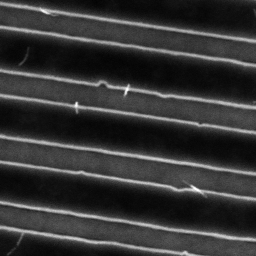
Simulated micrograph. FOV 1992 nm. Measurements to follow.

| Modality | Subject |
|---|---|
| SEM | one or a few lines or trenches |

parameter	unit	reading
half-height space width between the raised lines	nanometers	177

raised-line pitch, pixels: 66.2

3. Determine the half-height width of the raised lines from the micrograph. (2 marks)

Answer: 332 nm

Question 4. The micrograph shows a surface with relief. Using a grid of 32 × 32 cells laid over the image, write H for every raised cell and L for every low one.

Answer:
HHHHHHHHHHHHHHHHHHHHHHHHHHHHHHHH
LLLLLLHHHHHHHHHHHHHHHHHHHHHHHHHH
LLLLLLLLLLLLLHHHHHHHHHHHHHHHHHHH
HLLLLLLLLLLLLLLLLLLLHHHHHHHHHHHH
HHHHHHHHLLLLLLLLLLLLLLLLLLLHHHHH
HHHHHHHHHHHHHHHLLLLLLLLLLLLLLLLL
HHHHHHHHHHHHHHHHHHHHHHLLLLLLLLLL
HHHHHHHHHHHHHHHHHHHHHHHHHHHHHLLL
HHHHHHHHHHHHHHHHHHHHHHHHHHHHHHHH
LLLLHHHHHHHHHHHHHHHHHHHHHHHHHHHH
LLLLLLLLLLLHHHHHHHHHHHHHHHHHHHHH
LLLLLLLLLLLLLLLLLLHHHHHHHHHHHHHH
HHHHHLLLLLLLLLLLLLLLLLLLLHHHHHHH
HHHHHHHHHHHHLLLLLLLLLLLLLLLLLLLH
HHHHHHHHHHHHHHHHHHLLLLLLLLLLLLLL
HHHHHHHHHHHHHHHHHHHHHHHHHLLLLLLL
HHHHHHHHHHHHHHHHHHHHHHHHHHHHHHHH
LLHHHHHHHHHHHHHHHHHHHHHHHHHHHHHH
LLLLLLLLLLHHHHHHHHHHHHHHHHHHHHHH
LLLLLLLLLLLLLLLLLHHHHHHHHHHHHHHH
HHLLLLLLLLLLLLLLLLLLLLLHHHHHHHHH
HHHHHHHHHLLLLLLLLLLLLLLLLLLLLHHH
HHHHHHHHHHHHHHHHLLLLLLLLLLLLLLLL
HHHHHHHHHHHHHHHHHHHHHHLLLLLLLLLL
HHHHHHHHHHHHHHHHHHHHHHHHHHHHHHLL
LHHHHHHHHHHHHHHHHHHHHHHHHHHHHHHH
LLLLLLLHHHHHHHHHHHHHHHHHHHHHHHHH
LLLLLLLLLLLLLLHHHHHHHHHHHHHHHHHH
HLLLLLLLLLLLLLLLLLLLHHHHHHHHHHHH
HHHHHHHLLLLLLLLLLLLLLLLLLLLHHHHH
HHHHHHHHHHHHHHHLLLLLLLLLLLLLLLLL
HHHHHHHHHHHHHHHHHHHHHHLLLLLLLLLL